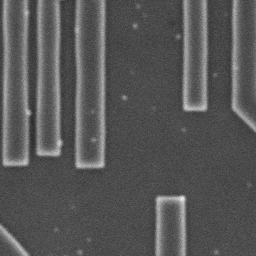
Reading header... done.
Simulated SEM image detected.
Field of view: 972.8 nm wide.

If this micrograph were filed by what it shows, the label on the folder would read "groups of lines, slits or small figures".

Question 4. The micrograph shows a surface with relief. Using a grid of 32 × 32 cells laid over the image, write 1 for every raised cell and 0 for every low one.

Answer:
01100110001110000000000111000111
01100110001110000000000111000111
01100110001110000000000111000111
01100110001110000000000111000111
01100110001110000000000111000111
01100110001110000000000111000111
01100110001110000000000111000111
01100110001110000000000111000111
01100110001110000000000111000111
01100110001110000000000111000111
01100110001110000000000111000111
01100110001110000000000111000111
01100110001110000000000111000111
01100110001110000000000111000111
01110110001110000000000000000011
01110110001110000000000000000001
11110110001110000000000000000000
11100111001110000000000000000000
11100111001110000000000000000000
11100000001110000000000000000000
01100000001110000000000000000000
00000000000000000000000000000000
00000000000000000000000000000000
00000000000000000000000000000000
00000000000000000000000000000000
00000000000000000000111000000000
00000000000000000000111000000000
00000000000000000000111000000000
00000000000000000000111000000000
10000000000000000000111000000000
11000000000000000000111000000000
11100000000000000000111000000000